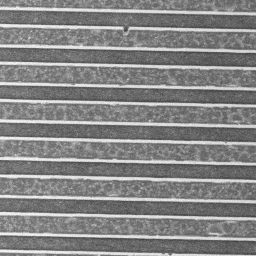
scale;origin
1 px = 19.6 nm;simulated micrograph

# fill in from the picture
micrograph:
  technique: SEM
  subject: parallel lines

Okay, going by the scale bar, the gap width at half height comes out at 338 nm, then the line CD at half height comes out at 392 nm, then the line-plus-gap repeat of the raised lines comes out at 736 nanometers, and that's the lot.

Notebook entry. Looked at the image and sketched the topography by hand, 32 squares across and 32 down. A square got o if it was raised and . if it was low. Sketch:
oooooooooooooooooooooooooooooooo
.......................ooooooooo
................................
ooooooooooo.....................
oooooooooooooooooooooooooooooooo
oooooooooooooooooooooooooooooooo
................................
................................
ooooooooooooooooooooooooooo.....
oooooooooooooooooooooooooooooooo
....oooooooooooooooooooooooooooo
................................
................................
oooooooooooooooooooooooooooooooo
oooooooooooooooooooooooooooooooo
....................oooooooooooo
................................
oooooooo........................
oooooooooooooooooooooooooooooooo
oooooooooooooooooooooooooooooooo
................................
................................
oooooooooooooooooooo.oo.........
oooooooooooooooooooooooooooooooo
.ooooooooooooooooooooooooooooooo
................................
................................
oooooooooooooooooooooooooooooooo
oooooooooooooooooooooooooooooooo
................oooooooooooooooo
................................
ooooo...........................